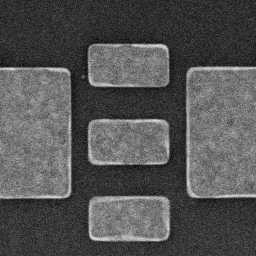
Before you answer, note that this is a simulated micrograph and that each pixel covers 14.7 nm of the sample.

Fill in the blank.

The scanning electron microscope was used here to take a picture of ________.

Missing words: wiring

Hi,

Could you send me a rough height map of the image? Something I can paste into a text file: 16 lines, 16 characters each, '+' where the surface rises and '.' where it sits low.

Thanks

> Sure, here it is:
................
................
................
......++++......
++++..+++++.++++
++++........++++
++++........++++
++++........++++
++++..++++..++++
++++..++++..++++
++++........++++
++++........++++
......++++......
......++++......
......++++......
................